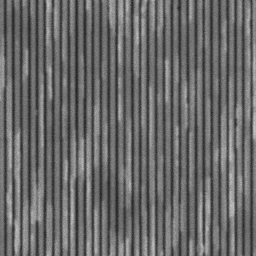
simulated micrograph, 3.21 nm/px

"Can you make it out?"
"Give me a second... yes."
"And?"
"parallel lines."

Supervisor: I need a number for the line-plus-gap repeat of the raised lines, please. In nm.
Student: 25.5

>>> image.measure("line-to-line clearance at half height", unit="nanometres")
8.4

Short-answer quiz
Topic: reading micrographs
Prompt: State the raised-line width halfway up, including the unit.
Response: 16.5 nanometres